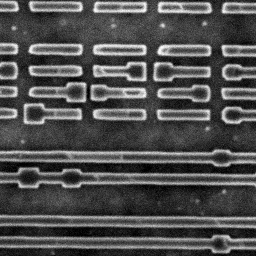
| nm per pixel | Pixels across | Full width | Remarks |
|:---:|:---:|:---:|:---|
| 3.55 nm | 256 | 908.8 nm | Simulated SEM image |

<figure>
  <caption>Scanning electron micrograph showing wiring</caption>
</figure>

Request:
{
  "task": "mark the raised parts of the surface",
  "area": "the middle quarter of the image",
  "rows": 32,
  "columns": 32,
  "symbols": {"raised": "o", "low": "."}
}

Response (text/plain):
ooo.....o......ooooo...ooooo....
oooo....oo..oooooooo...ooooooooo
oooo....oooooooooooo...ooooooooo
................oooo...oooo.....
................................
.oooo..oooo.....................
ooooo..ooooooooooooo....oooooooo
ooooo..ooooooooo...o....oooooooo
ooooo..oooo....................o
................................
................................
oooo....oooooooooooo............
oooo....oooooooooooo...ooooooooo
oooo....oooooooooooo....oooooooo
................................
................................
................................
................................
................................
................................
................................
................................
oooooooooooooooooooooooooooooooo
oooooooooooooooooooooooooooooooo
.......ooooooooooooooooooooooooo
................................
oooo............................
oooooooooooo....................
oooooooooooooooooooooooooooooooo
oooooooooooooooooooooooooooooooo
oooo............................
................................